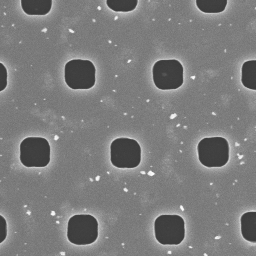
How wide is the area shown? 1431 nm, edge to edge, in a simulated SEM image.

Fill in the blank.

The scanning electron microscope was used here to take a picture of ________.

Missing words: holes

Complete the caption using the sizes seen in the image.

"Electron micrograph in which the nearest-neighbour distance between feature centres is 87.9 px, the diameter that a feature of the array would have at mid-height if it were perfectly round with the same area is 179 nanometers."